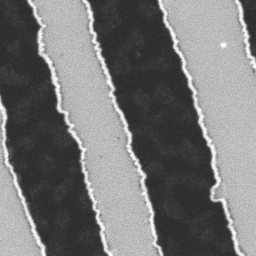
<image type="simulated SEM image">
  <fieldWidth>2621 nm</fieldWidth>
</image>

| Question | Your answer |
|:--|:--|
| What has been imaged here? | one or a few lines or trenches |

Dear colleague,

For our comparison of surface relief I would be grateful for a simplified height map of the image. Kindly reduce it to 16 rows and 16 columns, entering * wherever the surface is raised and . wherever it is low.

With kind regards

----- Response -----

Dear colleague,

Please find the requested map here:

**...*****.....*
***...*****....*
***...*****....*
***...*****.....
***....*****....
****...*****....
****...*****....
****....*****...
*****...*****...
*****...*****...
.****....****...
.*****...*****..
.*****...*****..
..****...*****..
..****....*****.
...****...*****.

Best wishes